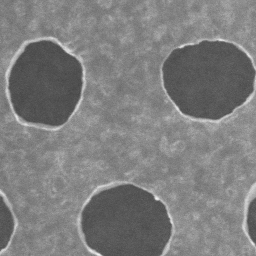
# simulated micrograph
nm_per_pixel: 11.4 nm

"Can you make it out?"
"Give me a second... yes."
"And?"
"holes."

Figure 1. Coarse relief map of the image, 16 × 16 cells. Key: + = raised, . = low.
++++++++++++++++
++++++++++++++++
++++++++++++++++
+....++++++....+
+....+++++......
+....+++++......
+....++++++....+
+...++++++++++++
++++++++++++++++
++++++++++++++++
++++++++++++++++
+++++++.++++++++
++++++....++++++
.++++......++++.
.++++......++++.
++++++....++++++